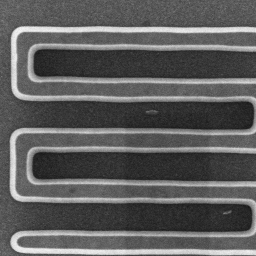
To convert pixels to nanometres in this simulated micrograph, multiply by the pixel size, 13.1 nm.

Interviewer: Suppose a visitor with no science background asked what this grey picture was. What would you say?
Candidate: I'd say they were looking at groups of lines, slits or small figures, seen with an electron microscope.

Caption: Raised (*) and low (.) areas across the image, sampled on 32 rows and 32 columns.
................................
................................
................................
................................
..******************************
..******************************
..**............................
..**............................
..**............................
..**............................
..******************************
..******************************
...............................*
................................
................................
................................
..***********************......*
..******************************
..******************************
..**............................
..**............................
..**............................
..**............................
..******************************
..******************************
...............................*
................................
................................
................................
..******************************
..******************************
...........***********..********